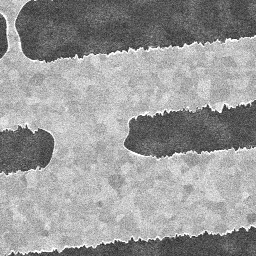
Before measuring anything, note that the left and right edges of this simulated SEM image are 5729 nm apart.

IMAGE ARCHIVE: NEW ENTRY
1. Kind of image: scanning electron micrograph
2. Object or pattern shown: one or a few lines or trenches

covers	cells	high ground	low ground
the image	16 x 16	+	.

+...............
+...............
+.............++
++...+++++++++++
++++++++++++++++
++++++++++++++++
+++++++++++++++.
++++++++........
...+++++........
...+++++.....+++
...+++++++++++++
++++++++++++++++
++++++++++++++++
++++++++++++++++
++++++++++++++..
++++............